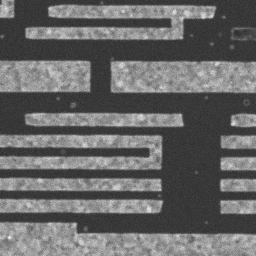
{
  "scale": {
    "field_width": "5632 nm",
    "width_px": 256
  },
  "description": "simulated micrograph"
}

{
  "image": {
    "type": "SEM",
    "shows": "wiring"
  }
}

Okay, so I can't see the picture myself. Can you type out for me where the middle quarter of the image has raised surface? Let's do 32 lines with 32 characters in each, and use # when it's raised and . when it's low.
######......####################
######......####################
######......####################
######......####################
######......####################
######......####################
######......####################
................................
................................
................................
..#.............................
................................
................................
#############################...
#############################...
................................
................................
................................
########################........
########################........
########################........
......................##........
......................##........
##...................###........
########################........
########################........
................................
................................
................................
########################........
########################........
................................